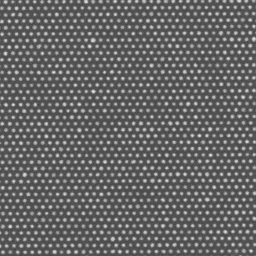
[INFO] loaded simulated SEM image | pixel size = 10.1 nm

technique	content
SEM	a regular array of raised bodies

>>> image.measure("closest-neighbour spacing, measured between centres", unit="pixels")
7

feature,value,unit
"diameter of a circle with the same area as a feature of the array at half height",0.0303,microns